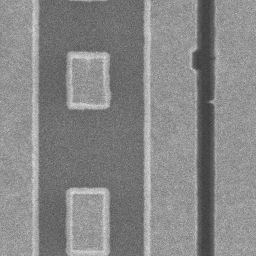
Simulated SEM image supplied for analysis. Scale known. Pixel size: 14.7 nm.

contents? one or a few lines or trenches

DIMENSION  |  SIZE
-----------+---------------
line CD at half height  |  738 nanometers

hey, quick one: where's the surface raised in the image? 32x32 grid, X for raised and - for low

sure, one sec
XXXX--------------XXXXXXX--XXXXX
XXXX--------------XXXXXXX--XXXXX
XXXX--------------XXXXXXX--XXXXX
XXXX--------------XXXXXXX--XXXXX
XXXX--------------XXXXXXX--XXXXX
XXXX--------------XXXXXXX--XXXXX
XXXX--------------XXXXXX---XXXXX
XXXX-----XXXX-----XXXXXX---XXXXX
XXXX-----XXXX-----XXXXXX---XXXXX
XXXX-----XXXX-----XXXXXXX--XXXXX
XXXX-----XXXX-----XXXXXXX--XXXXX
XXXX-----XXXX-----XXXXXXX--XXXXX
XXXX-----XXXX-----XXXXXXX--XXXXX
XXXX--------------XXXXXXX--XXXXX
XXXX--------------XXXXXXX--XXXXX
XXXX--------------XXXXXXX--XXXXX
XXXX--------------XXXXXXX--XXXXX
XXXX--------------XXXXXXX--XXXXX
XXXX--------------XXXXXXX--XXXXX
XXXX--------------XXXXXXX--XXXXX
XXXX--------------XXXXXXX--XXXXX
XXXX--------------XXXXXXX--XXXXX
XXXX--------------XXXXXXX--XXXXX
XXXX--------------XXXXXXX--XXXXX
XXXX-----XXXX-----XXXXXXX--XXXXX
XXXX-----XXXX-----XXXXXXX--XXXXX
XXXX-----XXXX-----XXXXXXX--XXXXX
XXXX-----XXXX-----XXXXXXX--XXXXX
XXXX-----XXXX-----XXXXXXX--XXXXX
XXXX-----XXXX-----XXXXXXX--XXXXX
XXXX-----XXXX-----XXXXXXX--XXXXX
XXXX-----XXXX-----XXXXXXX--XXXXX